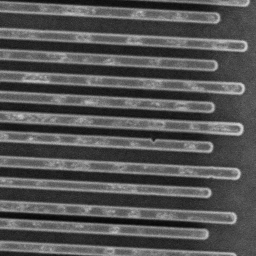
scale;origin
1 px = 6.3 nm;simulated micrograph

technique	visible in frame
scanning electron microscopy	parallel lines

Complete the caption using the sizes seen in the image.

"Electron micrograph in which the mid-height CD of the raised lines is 0.0629 µm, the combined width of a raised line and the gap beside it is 137 nm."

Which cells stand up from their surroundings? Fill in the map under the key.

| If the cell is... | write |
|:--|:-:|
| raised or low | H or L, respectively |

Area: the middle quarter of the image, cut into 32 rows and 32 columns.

LLLLLLLLLLLLLLLLLHHHHHHHHHHHHHHH
LLLLLLLLLLLLLLLLLLLLLLLLLLLLLLLL
LLLLLLLLLLLLLLLLLLLLLLLLLLLLLLLL
HHHHHHHHHHHHHHHLLLLLLLLLLLLLLLLL
HHHHHHHHHHHHHHHHHHHHHHHHHHHHHHHH
LLLLLLLLLLHHHHHHHHHHHHHHHHHHHHHH
LLLLLLLLLLLLLLLLLLLLLLLLLLLLHHHH
LLLLLLLLLLLLLLLLLLLLLLLLLLLLLLLL
HHHHHHHHHHHHHHHLLLLLLLLLLLLLLLLL
HHHHHHHHHHHHHHHHHHHHHHHHHHHHHHHH
LLLLLLHHHHHHHHHHHHHHHHHHHHHHHHHH
LLLLLLLLLLLLLLLLLLLLLLLLLHHHHHHH
LLLLLLLLLLLLLLLLLLLLLLLLLLLLLLLL
HHHHHHHHHHHHHHHHLLLLLLLLLLLLLLLL
HHHHHHHHHHHHHHHHHHHHHHHHHHHHHHHL
LLLLLLLHHHHHHHHHHHHHHHHHHHHHHHHH
LLLLLLLLLLLLLLLLLLLLLLLLLLHHHHHH
LLLLLLLLLLLLLLLLLLLLLLLLLLLLLLLL
HHHHHHHHHHHHHHHHHLLLLLLLLLLLLLLL
HHHHHHHHHHHHHHHHHHHHHHHHHHHHHHHH
LLLLLLLHHHHHHHHHHHHHHHHHHHHHHHHH
LLLLLLLLLLLLLLLLLLLLLLLLLLHHHHHH
LLLLLLLLLLLLLLLLLLLLLLLLLLLLLLLL
LLLLLLLLLLLLLLLLLLLLLLLLLLLLLLLL
HHHHHHHHHHHLLLLLLLLLLLLLLLLLLLLL
HHHHHHHHHHHHHHHHHHHHHHHHHHHHHHLL
LHHHHHHHHHHHHHHHHHHHHHHHHHHHHHHH
LLLLLLLLLLLLLLLLLLLLHHHHHHHHHHHH
LLLLLLLLLLLLLLLLLLLLLLLLLLLLLLLL
HHHLLLLLLLLLLLLLLLLLLLLLLLLLLLLL
HHHHHHHHHHHHHHHHHHHHHHLLLLLLLLLL
LLHHHHHHHHHHHHHHHHHHHHHHHHHHHHHH